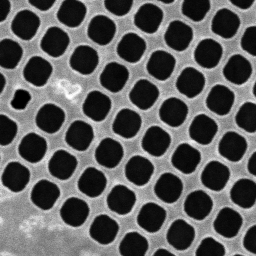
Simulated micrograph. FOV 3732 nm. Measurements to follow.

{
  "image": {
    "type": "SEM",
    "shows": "a regular array of holes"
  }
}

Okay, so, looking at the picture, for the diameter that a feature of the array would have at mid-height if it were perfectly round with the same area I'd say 0.431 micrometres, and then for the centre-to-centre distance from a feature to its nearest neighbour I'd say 0.494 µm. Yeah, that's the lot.